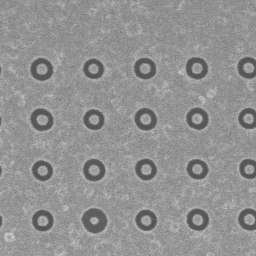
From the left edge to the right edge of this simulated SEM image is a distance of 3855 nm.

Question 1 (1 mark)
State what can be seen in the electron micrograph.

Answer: a regular array of ring-shaped grooves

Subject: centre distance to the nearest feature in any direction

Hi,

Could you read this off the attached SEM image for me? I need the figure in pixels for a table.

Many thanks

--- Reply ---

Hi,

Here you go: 50.3